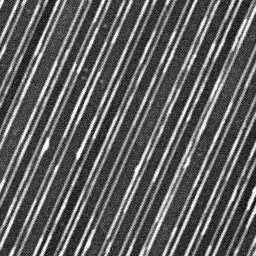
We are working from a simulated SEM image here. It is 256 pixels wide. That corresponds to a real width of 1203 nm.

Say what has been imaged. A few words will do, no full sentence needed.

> parallel lines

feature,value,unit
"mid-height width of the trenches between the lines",52.6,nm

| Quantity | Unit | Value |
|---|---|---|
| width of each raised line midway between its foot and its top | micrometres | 0.0365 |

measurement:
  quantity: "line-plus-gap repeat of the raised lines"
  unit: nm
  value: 92.6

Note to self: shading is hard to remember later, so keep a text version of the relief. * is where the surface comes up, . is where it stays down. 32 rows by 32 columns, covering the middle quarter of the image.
..***...**....**...**...**....**
..**...**....**...**...**....**.
.**....**...***...**...**....**.
.**...**....**...**...***...**..
***...**...***...**...**....**..
**...**....***..**....**...**...
**...**....**...**...**....**...
*...***...***...*....**....**...
*...**....**...**...**....**...*
...***...***...*....**....**...*
...**....**...**...**....**...**
...**....**...**...**....**...**
..***...**...**...***...**...***
..**....**...**...**....**...***
.**....***..**....**....*....**.
.**....**...**...**....**...**..
.**...***..**....**....**...**..
**....**...**...**....**...***..
**...***...*....**....**...**...
*....**...**...**....**...***...
*...***...**...**....**...**...*
....**...**...***...**...***...*
...***...**...**....**...**...**
...***..**....**...**....**...**
...**...**...**....**...**...**.
..***..**....**...***...**...**.
..**...**...**....**...***..**..
..**...*....**....**...**...**..
.**...**...**....**...***...*...
.**...**...**....**...**...**...
**...**...***...**...***...*....
**...**...**....**...**...**....